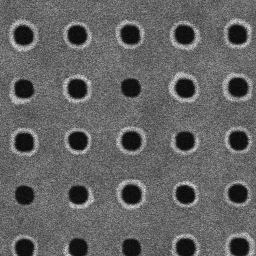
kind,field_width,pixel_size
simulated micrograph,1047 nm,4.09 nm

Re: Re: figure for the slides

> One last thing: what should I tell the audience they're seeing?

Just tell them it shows a regular array of holes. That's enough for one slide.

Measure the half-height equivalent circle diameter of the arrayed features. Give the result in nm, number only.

80.8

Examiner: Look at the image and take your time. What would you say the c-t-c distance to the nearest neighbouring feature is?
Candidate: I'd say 216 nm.